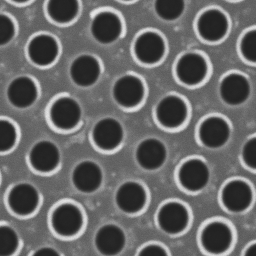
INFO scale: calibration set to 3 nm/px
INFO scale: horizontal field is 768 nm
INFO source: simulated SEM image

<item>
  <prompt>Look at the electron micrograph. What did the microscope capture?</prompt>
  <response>a regular array of holes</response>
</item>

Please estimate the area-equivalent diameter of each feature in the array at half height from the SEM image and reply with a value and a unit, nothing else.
84.8 nm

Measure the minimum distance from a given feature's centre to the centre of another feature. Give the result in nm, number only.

141